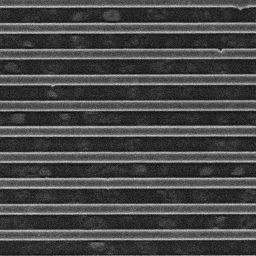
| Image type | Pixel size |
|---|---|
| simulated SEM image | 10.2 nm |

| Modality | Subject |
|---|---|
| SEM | parallel lines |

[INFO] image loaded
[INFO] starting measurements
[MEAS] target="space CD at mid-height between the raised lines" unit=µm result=0.171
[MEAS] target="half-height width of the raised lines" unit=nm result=98.1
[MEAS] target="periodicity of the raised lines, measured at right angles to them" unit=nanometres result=263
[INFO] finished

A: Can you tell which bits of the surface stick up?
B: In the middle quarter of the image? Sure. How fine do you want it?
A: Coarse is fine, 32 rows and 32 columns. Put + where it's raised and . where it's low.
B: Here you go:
................................
................................
................................
++++++++++++++++++++++++++++++++
++++++++++++++++++++++++++++++++
................................
................................
................................
................................
++++++++++++++++++++++++++++++++
++++++++++++++++++++++++++++++++
++++++++++......................
................................
................................
................................
................................
++++++++++++++++++++++++++++++++
++++++++++++++++++++++++++++++++
................................
................................
................................
................................
++++++++++++++++++++++++++++++++
++++++++++++++++++++++++++++++++
................................
................................
................................
................................
................................
++++++++++++++++++++++++++++++++
++++++++++++++++++++++++++++++++
................................